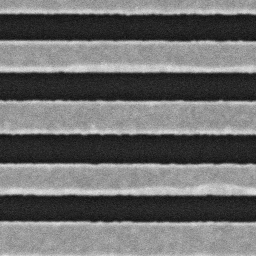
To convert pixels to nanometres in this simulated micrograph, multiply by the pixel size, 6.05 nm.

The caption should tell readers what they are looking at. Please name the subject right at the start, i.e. lines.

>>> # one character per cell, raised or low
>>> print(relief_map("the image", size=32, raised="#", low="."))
################################
################################
................................
................................
................................
################################
################################
################################
################################
................................
................................
................................
................................
################################
################################
################################
################################
................................
................................
................................
................................
################################
################################
################################
................................
................................
................................
................................
################################
################################
################################
################################